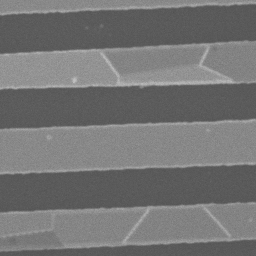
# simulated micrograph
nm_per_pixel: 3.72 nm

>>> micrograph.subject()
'lines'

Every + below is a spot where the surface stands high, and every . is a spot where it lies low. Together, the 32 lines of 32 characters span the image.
++++++++++++++++++++++++++++++..
+++++++++.......................
................................
................................
................................
........................++++++++
......++++++++++++++++++++++++++
++++++++++++++++++++++++++++++++
++++++++++++++++++++++++++++++++
++++++++++++++++++++++++++++++++
++++++++++++++++++++++++++......
................................
................................
................................
................................
..................++++++++++++++
++++++++++++++++++++++++++++++++
++++++++++++++++++++++++++++++++
++++++++++++++++++++++++++++++++
++++++++++++++++++++++++++++++++
++++++++++++++++++++++++++++++++
+++++...........................
................................
................................
................................
..........................+.++++
....++++++++++++++++++++++++++++
++++++++++++++++++++++++++++++++
++++++++++++++++++++++++++++++++
++++++++++++++++++++++++++++++++
+++++++++++++++++++.............
................................